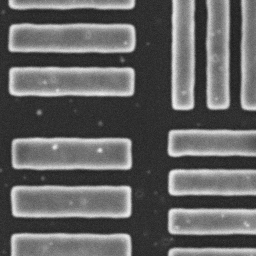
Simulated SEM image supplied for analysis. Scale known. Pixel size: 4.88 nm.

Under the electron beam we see groups of lines, slits or small figures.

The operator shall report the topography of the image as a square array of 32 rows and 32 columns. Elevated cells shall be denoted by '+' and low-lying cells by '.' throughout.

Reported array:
.++++++++++++++++.....++..+++.++
......................++..+++.++
......................++..+++.++
.++++++++++++++++.....++..+++.++
.++++++++++++++++.....++..+++.++
.++++++++++++++++.....++..+++.++
............+++.......++..+++.++
......................++..+++.++
...++.+...............++..+++.++
.++++++++++++++++.....++..+++.++
.++++++++++++++++.....++..+++.++
.++++++++++++++++.....++..+++.++
......................++..+++.++
......................++..++...+
................................
................................
......................++++++++++
..++++++++++++++.....+++++++++++
..++++++++++++++.....+++++++++++
..++++++++++++++................
..++++++++++++++................
......................++++++++++
.....................+++++++++++
..++++++++++++++.....+++++++++++
.+++++++++++++++................
..++++++++++++++................
..++++++++++++++.....+++++++++++
.....................+++++++++++
.....................+++++++++++
..++++++++++++++................
..++++++++++++++................
..++++++++++++++.....+++++++++++